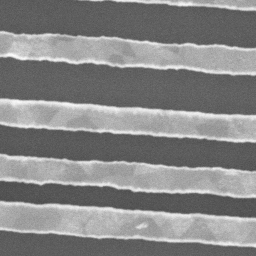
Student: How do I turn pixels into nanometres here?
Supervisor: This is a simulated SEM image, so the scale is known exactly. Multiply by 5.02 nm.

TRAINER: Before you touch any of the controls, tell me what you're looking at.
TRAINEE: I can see lines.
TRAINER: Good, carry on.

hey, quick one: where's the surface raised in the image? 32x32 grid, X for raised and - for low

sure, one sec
---------------------XXXXXXXXXXX
--------------------------------
--------------------------------
--------------------------------
XXXXXXXXX-----------------------
XXXXXXXXXXXXXXXXXXXXX--X--------
XXXXXXXXXXXXXXXXXXXXXXXXXXXXXXXX
----X-XXXXXXXXXXXXXXXXXXXXXXXXXX
-------------------XXXXXXXXXXXXX
--------------------------------
--------------------------------
--------------------------------
--------------------------------
XXXXXXXXXXXXXX------------------
XXXXXXXXXXXXXXXXXXXXXXXXXXXXXXXX
XXXXXXXXXXXXXXXXXXXXXXXXXXXXXXXX
-------------XXXXXXXXXXXXXXXXXXX
---------------------------XXXXX
--------------------------------
X-------------------------------
XXXXXXXXXXXXXXXXXX--------------
XXXXXXXXXXXXXXXXXXXXXXXXXXXXXXXX
XXXXXXXXXXXXXXXXXXXXXXXXXXXXXXXX
---------------XXXXXXXXXXXXXXXXX
-----------------------------XXX
XXXX----------------------------
XXXXXXXXXXXXXXXXXXX-------------
XXXXXXXXXXXXXXXXXXXXXXXXXXXXXXXX
XXXXXXXXXXXXXXXXXXXXXXXXXXXXXXXX
----------XXXXXXXXXXXXXXXXXXXXXX
---------------------------XXXXX
--------------------------------